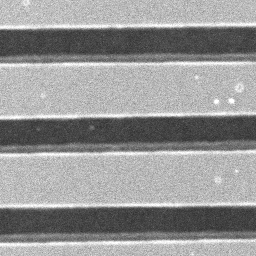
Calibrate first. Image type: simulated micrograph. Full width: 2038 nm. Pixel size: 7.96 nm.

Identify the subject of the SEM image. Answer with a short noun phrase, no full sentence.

lines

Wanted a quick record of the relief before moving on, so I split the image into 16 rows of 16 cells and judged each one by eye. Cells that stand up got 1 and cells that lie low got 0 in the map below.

1111111111111111
1111111111111111
0000000000000000
0000000000000000
1111111111111111
1111111111111111
1111111111111111
0000000000000000
0000000000000000
0000000111111111
1111111111111111
1111111111111111
1111111111111111
0000000000000000
0000000000000000
1111111111111111